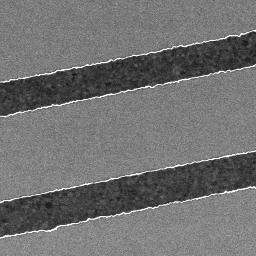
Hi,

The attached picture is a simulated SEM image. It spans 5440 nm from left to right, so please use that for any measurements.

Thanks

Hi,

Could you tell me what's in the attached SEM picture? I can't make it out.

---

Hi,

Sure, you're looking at one or a few lines or trenches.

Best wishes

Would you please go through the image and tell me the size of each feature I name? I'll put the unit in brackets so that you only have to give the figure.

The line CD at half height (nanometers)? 741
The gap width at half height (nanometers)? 1770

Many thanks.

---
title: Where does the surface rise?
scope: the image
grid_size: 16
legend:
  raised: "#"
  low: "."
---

................
................
.............###
........########
...###########..
#########.......
####............
................
................
................
..........######
.....###########
.###########....
#######.........
##..............
................